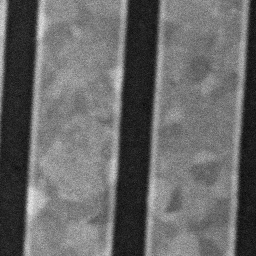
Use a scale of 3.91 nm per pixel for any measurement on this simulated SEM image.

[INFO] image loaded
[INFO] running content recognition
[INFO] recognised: one or a few lines or trenches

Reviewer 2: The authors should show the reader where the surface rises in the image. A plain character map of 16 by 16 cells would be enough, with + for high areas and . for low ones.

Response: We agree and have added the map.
...+++++..+++++.
...+++++..+++++.
..++++++..+++++.
..++++++..+++++.
..+++++...+++++.
..+++++...+++++.
..+++++...+++++.
..+++++...+++++.
..+++++...+++++.
..+++++...+++++.
..+++++...+++++.
..+++++..++++++.
..+++++..++++++.
..+++++..++++++.
..+++++..++++++.
..+++++..++++++.